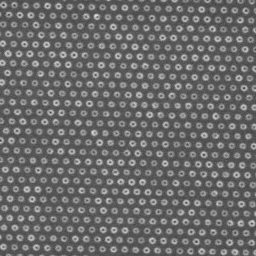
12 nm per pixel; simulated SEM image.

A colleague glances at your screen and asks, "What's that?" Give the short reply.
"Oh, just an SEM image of a regular array of holes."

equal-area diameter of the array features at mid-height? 3.56 px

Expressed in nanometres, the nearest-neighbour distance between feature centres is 129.